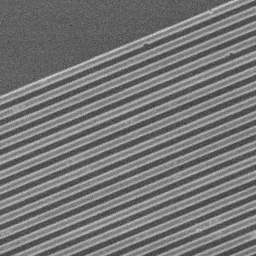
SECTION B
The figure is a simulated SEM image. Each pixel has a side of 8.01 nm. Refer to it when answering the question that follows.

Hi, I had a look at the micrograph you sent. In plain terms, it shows parallel lines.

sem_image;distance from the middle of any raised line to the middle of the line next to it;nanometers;111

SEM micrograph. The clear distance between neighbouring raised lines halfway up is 7.28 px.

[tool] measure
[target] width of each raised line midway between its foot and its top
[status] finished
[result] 50.9 nanometres